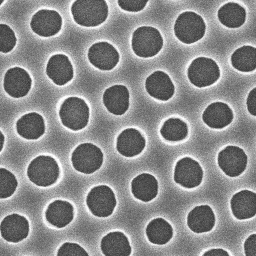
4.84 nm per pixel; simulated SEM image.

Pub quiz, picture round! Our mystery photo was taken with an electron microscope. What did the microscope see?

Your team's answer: a regular array of holes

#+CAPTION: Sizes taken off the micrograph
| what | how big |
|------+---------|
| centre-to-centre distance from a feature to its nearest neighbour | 218 nm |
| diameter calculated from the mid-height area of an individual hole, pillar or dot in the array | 146 nanometers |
